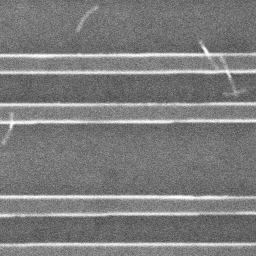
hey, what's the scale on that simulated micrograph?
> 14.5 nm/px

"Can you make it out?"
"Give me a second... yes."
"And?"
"lines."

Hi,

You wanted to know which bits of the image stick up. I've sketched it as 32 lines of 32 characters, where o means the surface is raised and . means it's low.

................................
................................
................................
................................
................................
................................
................................
oooooooooooooooooooooooooooooooo
oooooooooooooooooooooooooooooooo
................................
................................
................................
................................
oooooooooooooooooooooooooooooooo
oooooooooooooooooooooooooooooooo
................................
................................
................................
................................
................................
................................
................................
................................
................................
................................
oooooooooooooooooooooooooooooooo
oooooooooooooooooooooooooooooooo
................................
................................
................................
.....oooo...........oooooooooooo
oooooooooooooooooooooooooooooooo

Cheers